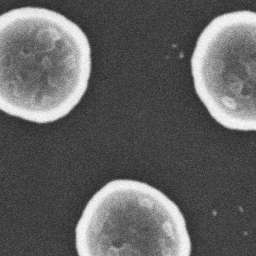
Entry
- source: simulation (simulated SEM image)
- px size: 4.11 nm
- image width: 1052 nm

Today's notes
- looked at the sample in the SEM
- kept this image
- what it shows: raised bodies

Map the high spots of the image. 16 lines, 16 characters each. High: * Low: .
................
****..........**
*****........***
*****.......****
*****.......****
*****........***
****.........***
..............**
................
................
................
................
......****......
.....******.....
.....******.....
.....*******....